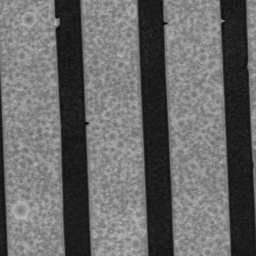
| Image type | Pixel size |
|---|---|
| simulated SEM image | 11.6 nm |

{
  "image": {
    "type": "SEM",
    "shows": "one or a few lines or trenches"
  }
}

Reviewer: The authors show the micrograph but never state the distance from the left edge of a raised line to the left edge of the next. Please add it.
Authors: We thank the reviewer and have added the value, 0.959 microns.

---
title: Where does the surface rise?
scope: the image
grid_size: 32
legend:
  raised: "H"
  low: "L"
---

HHHHHHHLLLHHHHHHHLLLHHHHHHHLLLLH
HHHHHHHLLLHHHHHHHLLLHHHHHHHLLLLH
HHHHHHHLLLHHHHHHHLLLHHHHHHHHLLLH
HHHHHHHLLLHHHHHHHLLLLHHHHHHHLLLH
HHHHHHHLLLHHHHHHHLLLLHHHHHHHLLLH
HHHHHHHLLLHHHHHHHLLLLHHHHHHHLLLH
HHHHHHHLLLHHHHHHHLLLLHHHHHHHLLLH
HHHHHHHLLLHHHHHHHLLLLHHHHHHHLLLH
HHHHHHHLLLHHHHHHHLLLLHHHHHHHLLLH
HHHHHHHLLLLHHHHHHLLLLHHHHHHHLLLH
HHHHHHHLLLLHHHHHHHLLLHHHHHHHLLLH
HHHHHHHLLLLHHHHHHHLLLHHHHHHHLLLH
HHHHHHHLLLLHHHHHHHLLLHHHHHHHLLLH
HHHHHHHLLLLHHHHHHHLLLHHHHHHHLLLH
HHHHHHHLLLLHHHHHHHLLLHHHHHHHLLLH
HHHHHHHHLLLHHHHHHHLLLHHHHHHHLLLH
HHHHHHHHLLLHHHHHHHLLLHHHHHHHLLLH
HHHHHHHHLLLHHHHHHHLLLHHHHHHHLLLH
HHHHHHHHLLLHHHHHHHLLLHHHHHHHLLLH
LHHHHHHHLLLHHHHHHHLLLHHHHHHHLLLL
LHHHHHHHLLLHHHHHHHLLLHHHHHHHLLLL
LHHHHHHHLLLHHHHHHHLLLHHHHHHHLLLL
LHHHHHHHLLLHHHHHHHLLLHHHHHHHLLLL
LHHHHHHHLLLHHHHHHHLLLHHHHHHHHLLL
LHHHHHHHLLLHHHHHHHLLLLHHHHHHHLLL
LHHHHHHHLLLHHHHHHHLLLLHHHHHHHLLL
LHHHHHHHLLLHHHHHHHLLLLHHHHHHHLLL
LHHHHHHHLLLHHHHHHHLLLLHHHHHHHLLL
LHHHHHHHLLLHHHHHHHLLLLHHHHHHHLLL
LHHHHHHHLLLHHHHHHHLLLLHHHHHHHLLL
LHHHHHHHLLLHHHHHHHLLLLHHHHHHHLLL
LHHHHHHHLLLHHHHHHHLLLLHHHHHHHLLL